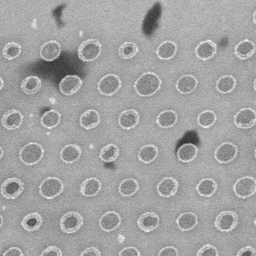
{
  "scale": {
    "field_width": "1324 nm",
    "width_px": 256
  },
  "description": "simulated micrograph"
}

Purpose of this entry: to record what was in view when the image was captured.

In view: a regular array of raised bodies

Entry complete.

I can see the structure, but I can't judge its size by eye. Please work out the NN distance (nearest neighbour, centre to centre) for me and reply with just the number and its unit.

200 nanometres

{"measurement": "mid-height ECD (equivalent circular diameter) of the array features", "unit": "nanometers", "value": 95.1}